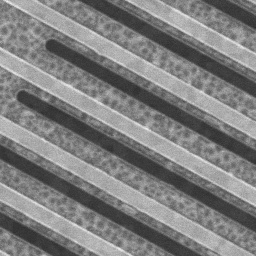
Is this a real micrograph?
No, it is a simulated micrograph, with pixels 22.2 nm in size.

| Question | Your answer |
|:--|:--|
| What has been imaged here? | parallel lines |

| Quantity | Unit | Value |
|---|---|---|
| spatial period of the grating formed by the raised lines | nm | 651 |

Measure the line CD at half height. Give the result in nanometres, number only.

323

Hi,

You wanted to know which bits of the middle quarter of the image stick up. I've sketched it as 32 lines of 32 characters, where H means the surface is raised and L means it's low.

LLLHHHHHHHLLLLLHHHHHHHHLLLLLLLLL
LLLLHHHHHHHHLLLLLHHHHHHHLLLLLLLL
LLLLLLHHHHHHHHLLLLHHHHHHHHLLLLLL
LLLLLLLLHHHHHHHLLLLLHHHHHHHHLLLL
LLLLLLLLLLHHHHHHHLLLLLHHHHHHHHLL
HLLLLLLLLLLLHHHHHHHLLLLLHHHHHHHH
HHHLLLLLLLLLLHHHHHHHHLLLLLHHHHHH
HHHHHLLLLLLLLLLHHHHHHHHLLLLLHHHH
HHHHHHHLLLLLLLLLLHHHHHHHLLLLLHHH
LHHHHHHHLLLLLLLLLLLHHHHHHHLLLLLH
LLHHHHHHHHLLLLLLLLLLLHHHHHHHLLLL
LLLLHHHHHHHHLLLLLLLLLLLHHHHHHHLL
HLLLLLHHHHHHHHLLLLLLLLLLHHHHHHHH
HHHLLLLLHHHHHHHHLLLLLLLLLLHHHHHH
HHHHHLLLLLHHHHHHHLLLLLLLLLLLHHHH
HHHHHHHLLLLHHHHHHHHLLLLLLLLLLLHH
LHHHHHHHHLLLLHHHHHHHHLLLLLLLLLLL
LLLHHHHHHHLLLLLHHHHHHHHLLLLLLLLL
LLLLLHHHHHHHLLLLLHHHHHHHHLLLLLLL
LLLLLLLHHHHHHHLLLLLHHHHHHHHLLLLL
LLLLLLLLHHHHHHHHLLLLLHHHHHHHLLLL
LLLLLLLLLLHHHHHHHHLLLLHHHHHHHHLL
HLLLLLLLLLLLHHHHHHHLLLLLHHHHHHHH
HHHLLLLLLLLLLLHHHHHHHHLLLLHHHHHH
HHHHHLLLLLLLLLLLHHHHHHHLLLLLHHHH
HHHHHHHLLLLLLLLLLHHHHHHHHLLLLLHH
LHHHHHHHHLLLLLLLLLLHHHHHHHHLLLLH
LLLHHHHHHHLLLLLLLLLLLHHHHHHHLLLL
LLLLLHHHHHHHLLLLLLLLLLLHHHHHHHLL
HLLLLLHHHHHHHHLLLLLLLLLLLHHHHHHH
HHHLLLLLHHHHHHHHLLLLLLLLLLLHHHHH
HHHHHLLLLLHHHHHHHHLLLLLLLLLLHHHH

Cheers